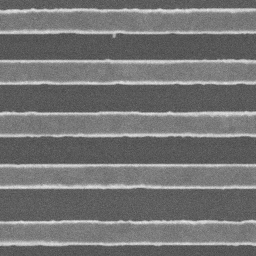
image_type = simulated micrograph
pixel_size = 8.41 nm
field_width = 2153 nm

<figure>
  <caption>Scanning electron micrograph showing lines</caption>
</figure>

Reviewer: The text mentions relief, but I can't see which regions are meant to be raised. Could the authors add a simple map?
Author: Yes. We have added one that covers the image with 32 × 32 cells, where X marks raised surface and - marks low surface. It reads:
--------------------------------
XXXXXXXXXXXXXXXXXXXXXXXXXXXXXXXX
XXXXXXXXXXXXXXXXXXXXXXXXXXXXXXXX
XXXXXXXXXXXXXXXXXXXXXXXXXXXXXXXX
--------------------------------
--------------------------------
--------------------------------
-------------X--------------XXX-
XXXXXXXXXXXXXXXXXXXXXXXXXXXXXXXX
XXXXXXXXXXXXXXXXXXXXXXXXXXXXXXXX
XXXXX-XXXXXXXXXXXXXXXXXX--XXXXXX
--------------------------------
--------------------------------
--------------------------------
XXXXXXXXXXXXXXXXXXXXXXXXXXXXXXXX
XXXXXXXXXXXXXXXXXXXXXXXXXXXXXXXX
XXXXXXXXXXXXXXXXXXXXXXXXXXXXXXXX
--------------------------------
--------------------------------
--------------------------------
--------------------------------
XXXXXXXXXXXXXXXXXXXXXXXXXXXXXXXX
XXXXXXXXXXXXXXXXXXXXXXXXXXXXXXXX
XXXXXXXXXXXXXXXXX-XXXXXXXXXXXXXX
--------------------------------
--------------------------------
--------------------------------
--------------------------------
XXXXXXXXXXXXXXXXXXXXXXXXXXXXXXXX
XXXXXXXXXXXXXXXXXXXXXXXXXXXXXXXX
XXXXXXXXXXXXXXXXXXXXXXXXXXXXXXXX
--------------------------------